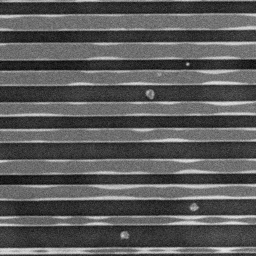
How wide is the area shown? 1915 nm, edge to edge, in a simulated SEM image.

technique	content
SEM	groups of lines, slits or small figures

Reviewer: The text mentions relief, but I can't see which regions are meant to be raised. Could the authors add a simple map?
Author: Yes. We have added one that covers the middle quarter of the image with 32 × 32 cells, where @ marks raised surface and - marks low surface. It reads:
--------------------------------
--------------------------------
@@@@@@@@@@@@@@@@@@@@@@@@@@@@@@@@
@@@@@@@@@@@@@@@@@@@@@@@@@@@@@@@@
@@@@@@@@@@@@@@@@@@@@@@@@@@@@@@@@
--------------------------------
--------------------------------
--------------------------------
--------------------------------
--------------------------------
@@@@@@@@@@@@@@@@@@@@@@@@@@@@@@@@
@@@@@@@@@@@@@@@@@@@@@@@@@@@@@@@@
@@@@@@@@@@@@@@@@@@@@@@@@@@@@@@@@
--------------------------------
--------------------------------
--------------------------------
@@@@@@@@@@@@@@@@@@@-@@@@@@@@@@@@
@@@@@@@@@@@@@@@@@@@@@@@@@@@@@@@@
@@@@@@@@@@@@@@@@@@@@@@@@@@@@@@@@
--------------------------------
--------------------------------
--------------------------------
--------------------------------
--------------------------------
@@@@@@@@@@@@@@@@@@@@@@@@@@@@@@@@
@@@@@@@@@@@@@@@@@@@@@@@@@@@@@@@@
@@@@@@@@@@@@@@@@@@@@@@@@@@@@@@@@
--------------------------------
--------------------------------
--------------------------------
@@@@@@@@@--------@@@@@@@@@@@@@@@
@@@@@@@@@@@@@@@@@@@@@@@@@@@@@@@@